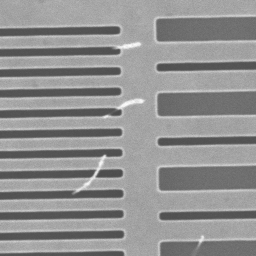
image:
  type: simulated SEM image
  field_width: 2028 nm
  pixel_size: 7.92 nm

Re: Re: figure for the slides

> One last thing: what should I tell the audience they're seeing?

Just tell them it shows groups of lines, slits or small figures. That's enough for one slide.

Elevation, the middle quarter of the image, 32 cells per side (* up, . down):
***********************.........
..............*********.........
..............******************
********************************
********************************
********************************
..............******************
..............**********........
***********************.........
***********************.........
***********************.........
..............*********.........
..............*********.........
********************************
********************************
********************************
..............******************
..............******************
************************........
***********************.........
************************...*****
..............******************
...............*****************
..******************************
********************************
********************************
........*.....**********........
...............*********........
.......*.....***********........
************************........
************************........
*******.......**********........